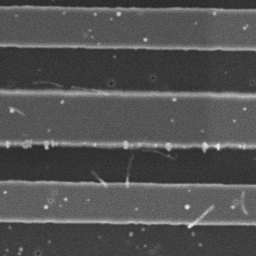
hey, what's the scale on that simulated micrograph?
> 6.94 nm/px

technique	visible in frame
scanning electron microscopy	lines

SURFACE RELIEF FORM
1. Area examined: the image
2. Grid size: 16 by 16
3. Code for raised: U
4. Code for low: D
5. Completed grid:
UUUUUUUUUDUUDDDD
UUUUUUUUUUUUUUUU
UUUUUUUUUUUUUUUU
DDDDDDDDDDDDDDDD
DDDDDDDDDDDDDDDD
DDDDDDDDDDDDDDDD
UUUUUUUUUUUUUUUU
UUUUUUUUUUUUUUUU
UUUUUUUUUUUUUUUU
DDDDDDDDDDDDDDDD
DDDDDDDDDDDDDDDD
UUUUUUUUUUDDDDDD
UUUUUUUUUUUUUUUU
UUUUUUUUUUUUUUUU
DDDDDDDDDDDDDDDD
DDDDDDDDDDDDDDDD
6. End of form